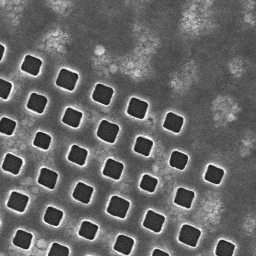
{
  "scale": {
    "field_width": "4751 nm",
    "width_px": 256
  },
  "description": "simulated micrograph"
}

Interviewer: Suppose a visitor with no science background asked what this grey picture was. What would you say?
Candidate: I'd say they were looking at a regular array of holes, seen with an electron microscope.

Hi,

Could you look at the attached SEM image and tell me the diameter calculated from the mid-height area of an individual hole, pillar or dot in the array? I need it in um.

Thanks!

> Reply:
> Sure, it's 0.375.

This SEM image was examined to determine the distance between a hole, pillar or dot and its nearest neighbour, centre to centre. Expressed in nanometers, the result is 702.